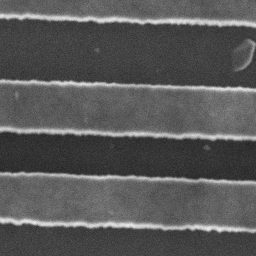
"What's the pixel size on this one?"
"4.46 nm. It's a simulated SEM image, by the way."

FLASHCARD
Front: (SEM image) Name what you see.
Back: lines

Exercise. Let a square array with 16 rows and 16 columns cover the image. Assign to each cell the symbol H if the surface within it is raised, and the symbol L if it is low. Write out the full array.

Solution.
HHHHHHHHHHHHHHHH
LLLLLLLLLLLLLLHH
LLLLLLLLLLLLLLLL
LLLLLLLLLLLLLLLL
LLLLLLLLLLLLLLLL
HHHHHHHHHHHHHHLL
HHHHHHHHHHHHHHHH
HHHHHHHHHHHHHHHH
LLLLLLLLLHHHHHHH
LLLLLLLLLLLLLLLL
LLLLLLLLLLLLLLLL
HHHHHHHHHHHHHHHH
HHHHHHHHHHHHHHHH
HHHHHHHHHHHHHHHH
LLLLLLLLLLLLLLLL
LLLLLLLLLLLLLLLL